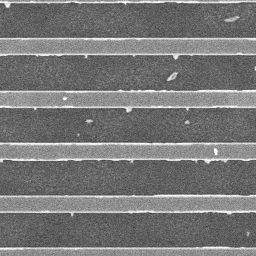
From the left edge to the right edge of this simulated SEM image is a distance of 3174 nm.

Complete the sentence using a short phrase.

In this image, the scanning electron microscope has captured lines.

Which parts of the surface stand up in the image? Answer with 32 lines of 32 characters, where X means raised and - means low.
--------------------------------
--------------------------------
--------------------------------
--------------------------------
--------------------------------
XXXXXXXXXXXXXXXXXXXXXXXXXXXXXXXX
XXXXXXXXXXXXXXXXXXXXXXXXXXXXXXXX
--------------------------------
--------------------------------
--------------------------------
--------------------------------
XXXXXXXXXXXXXXXXXXXXXXXXXXXXXXXX
XXXXXXXXXXXXXXXXXXXXXXXXXXXXXXXX
--------------------------------
--------------------------------
--------------------------------
--------------------------------
--------------------------------
XXXXXXXXXXXXXXXXXXXXXXXXXXXXXXXX
XXXXXXXXXXXXXXXXXXXXXXXXXXXXXXXX
--------------------------------
--------------------------------
--------------------------------
--------------------------------
-------------------XXXXXXXXXXX-X
XXXXXXXXXXXXXXXXXXXXXXXXXXXXXXXX
XXXXXXXXXXXXXXXXXXXXXXXXXXXXXXXX
--------------------------------
--------------------------------
--------------------------------
--------------------------------
XXXXXXXXXXXXXXXXXXXXXXXXXXXXXXXX